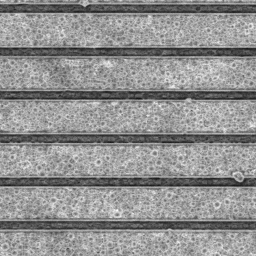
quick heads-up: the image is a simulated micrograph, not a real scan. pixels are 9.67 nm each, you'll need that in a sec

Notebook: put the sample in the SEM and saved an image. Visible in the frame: parallel lines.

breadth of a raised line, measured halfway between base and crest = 0.333 microns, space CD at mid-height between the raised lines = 0.0907 µm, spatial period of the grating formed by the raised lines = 43.4 px